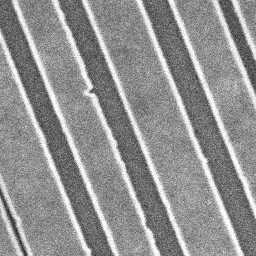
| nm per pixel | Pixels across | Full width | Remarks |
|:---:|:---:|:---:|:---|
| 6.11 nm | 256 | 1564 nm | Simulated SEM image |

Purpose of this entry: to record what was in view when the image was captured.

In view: one or a few lines or trenches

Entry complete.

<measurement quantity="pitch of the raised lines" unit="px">72.3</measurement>